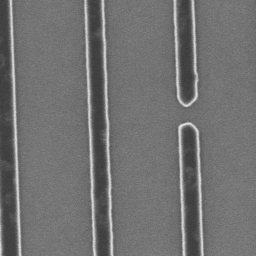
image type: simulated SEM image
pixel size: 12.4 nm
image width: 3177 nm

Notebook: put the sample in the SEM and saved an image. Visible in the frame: one or a few lines or trenches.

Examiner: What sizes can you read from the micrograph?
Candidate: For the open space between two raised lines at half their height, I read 914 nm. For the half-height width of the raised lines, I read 0.226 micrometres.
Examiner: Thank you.